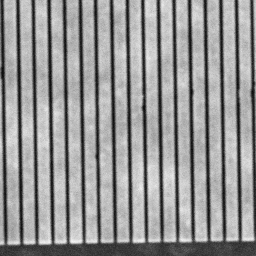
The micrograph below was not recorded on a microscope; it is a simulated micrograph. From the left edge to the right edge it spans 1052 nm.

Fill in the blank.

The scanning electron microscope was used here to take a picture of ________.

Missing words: parallel lines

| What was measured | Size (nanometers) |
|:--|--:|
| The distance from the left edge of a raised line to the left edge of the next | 64.1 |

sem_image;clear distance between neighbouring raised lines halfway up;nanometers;14.4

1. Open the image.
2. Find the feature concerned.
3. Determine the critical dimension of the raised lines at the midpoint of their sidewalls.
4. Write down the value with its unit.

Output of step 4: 51.3 nm